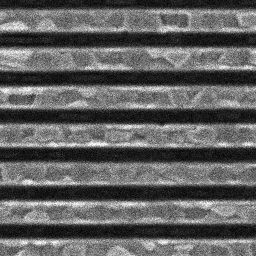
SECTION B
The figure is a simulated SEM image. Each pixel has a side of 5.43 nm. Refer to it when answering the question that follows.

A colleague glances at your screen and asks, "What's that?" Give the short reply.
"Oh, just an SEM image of parallel lines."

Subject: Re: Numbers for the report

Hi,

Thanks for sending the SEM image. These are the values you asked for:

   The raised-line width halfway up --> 131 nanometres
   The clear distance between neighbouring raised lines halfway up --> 80.1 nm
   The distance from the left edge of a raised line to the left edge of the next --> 208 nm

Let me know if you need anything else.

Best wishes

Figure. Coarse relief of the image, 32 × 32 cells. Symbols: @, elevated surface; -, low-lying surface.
--------------------------------
@@@@@@@@@@@@@@@@@@@@@@@@@@@@@@@@
@@@@@@@@@@@@@@@@@@@@@@@@@@@@@@@@
@@@@@@@@@@@@@@@@@@@@@@@@@@@@@@@@
--------------------------------
--------------------------------
@@@@@@@@@@@@@@@@@@@@@@@@@@@@@@@@
@@@@@@@@@@@@@@@@@@@@@@@@@@@@@@@@
@@@@@@@@@@@@@@@@@@@@@@@@@@@@@@@@
--------------------------------
--------------------------------
@@@@@@@@@@@@@@@@@@@@@@@@@@@@@@@@
@@@@@@@@@@@@@@@@@@@@@@@@@@@@@@@@
@@@@@@@@@@@@@@@@@@@@@@@@@@@@@@@@
--------------------------------
-@@@--@@----------------@-------
@@@@@@@@@@@@@@@@@@@@@@@@@@@@@@@@
@@@@@@@@@@@@@@@@@@@@@@@@@@@@@@@@
--------------------------------
--------------------------------
@@@@@@@@@@@@@@@@@@@@@@@@@@@@@@@@
@@@@@@@@@@@@@@@@@@@@@@@@@@@@@@@@
@@@@@@@@@@@@@@@@@@@@@@@@@@@@@@@@
--------------------------------
--------------------------------
@@@@@@@@@@@@@@@@@@@@@@@@@@@@@@@@
@@@@@@@@@@@@@@@@@@@@@@@@@@@@@@@@
@@@@@@@@@@@@@@@@@@@@@@@@@@@@@@@@
--------------------------------
--------------------------------
@@@@@@@@@@@@@@@@@@@@@@@@@@@@@@@@
@@@@@@@@@@@@@@@@@@@@@@@@@@@@@@@@